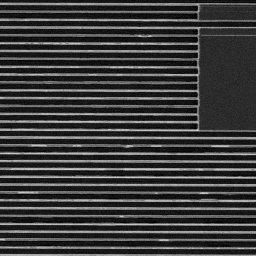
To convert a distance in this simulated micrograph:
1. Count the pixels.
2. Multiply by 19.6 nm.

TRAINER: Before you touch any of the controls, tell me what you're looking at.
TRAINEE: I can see parallel lines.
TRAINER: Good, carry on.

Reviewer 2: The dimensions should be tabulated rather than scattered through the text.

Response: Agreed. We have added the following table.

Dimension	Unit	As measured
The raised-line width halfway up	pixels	1.88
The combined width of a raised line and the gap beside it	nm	154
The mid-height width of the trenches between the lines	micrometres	0.127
